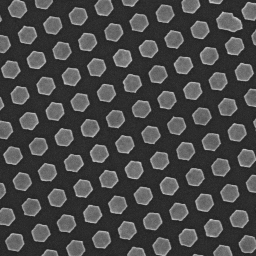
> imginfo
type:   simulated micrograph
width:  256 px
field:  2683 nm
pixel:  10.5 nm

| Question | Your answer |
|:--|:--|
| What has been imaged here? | a regular array of raised bodies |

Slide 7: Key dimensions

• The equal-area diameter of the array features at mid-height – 17.8 pixels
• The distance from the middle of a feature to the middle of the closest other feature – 284 nm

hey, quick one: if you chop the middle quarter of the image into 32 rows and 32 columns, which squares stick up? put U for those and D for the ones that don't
DDDDDDUUUUDDDDUUDDDDDDDDDDDDUUUU
DUUDDDUUUUDDDDDDDDDDDDUUUDDDUUUU
UUUUDDDUUUDDDDDDDDDDDUUUUUDDDDDD
UUUUDDDDDDDDDDDDUUUDDDUUUDDDDDDD
UUUDDDDDDDDDDDDUUUUDDDUUUDDDDDDD
DDDDDDDDDUUUDDDUUUUDDDDDDDDDDDUU
DDDDDDDDDUUUUDDUUUDDDDDDDDDDDDUU
DDDUUDDDUUUUUDDDDDDDDDDDUUUUDDUU
DDUUUUDDDUUUDDDDDDDDDDDDUUUUDDDU
DDUUUUDDDDDDDDDDDDUUUDDDUUUUDDDD
DDUUUUDDDDDDDDDDDUUUUDDDUUUDDDDD
DDDUUDDDDDDDDDDDDUUUUUDDDDDDDDDD
DDDDDDDDDDDUUUUDDUUUUDDDDDDDDDDD
DDDDDDDDDDDUUUUDDDDDDDDDDDDUUDDD
DDDDDUUUDDDUUUUDDDDDDDDDDDUUUUDD
DDDDUUUUUDDUUUDDDDDDDDDDDDUUUUDD
UDDDUUUUUDDDDDDDDDDDUUUUDDUUUUDD
UUDDDUUUDDDDDDDDDDDUUUUUDDDDUDDD
UUDDDDDDDDDDDDUUUDDDUUUUDDDDDDDD
UUDDDDDDDDDDDUUUUDDDUUUDDDDDDDDD
UDDDDDDDUUDDDUUUUDDDDDDDDDDDDUUU
DDDDDDDUUUUDDUUUUDDDDDDDDDDDUUUU
DDDDDDDUUUUDDDDDDDDDDDDUUUDDUUUU
DUUUDDDUUUUDDDDDDDDDDDUUUUDDDUUU
UUUUUDDDUDDDDDDDDUDDDDUUUUDDDDDD
UUUUUDDDDDDDDDDDUUUDDDUUUUDDDDDD
DUUUDDDDDDDDDDDUUUUUDDDDDDDDDDDD
DDDDDDDDDDUUUDDDUUUDDDDDDDDDDDDU
DDDDDDDDDUUUUDDDUUUDDDDDDUUDDDDU
DDDUUUDDDUUUUDDDDDDDDDDDUUUUDDDU
DDDUUUUDDDUUDDDDDDDDDDDDUUUUUDDD
DDDUUUUDDDDDDDDDDDUUUUDDUUUUDDDD